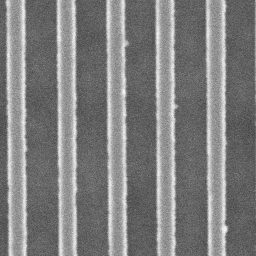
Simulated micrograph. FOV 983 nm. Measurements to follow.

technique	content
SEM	lines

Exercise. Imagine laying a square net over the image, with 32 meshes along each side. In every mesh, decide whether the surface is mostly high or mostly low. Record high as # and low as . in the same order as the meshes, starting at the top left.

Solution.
.##....##....###....##....##....
.##....##....###....##....##....
.##....##....###....##....##....
.##....##....###....##....##....
.##....##....###....##....##....
.##....##....###....##....##....
.##....##....###....##....##....
.##....##....###....##....##....
.##....##.....##....##....##....
.##....##.....##....##....##....
.##....##.....##....##....##....
.##....##.....##....##....##....
.##....##.....##....##....##....
.##....##.....##....##....##....
.##....##.....##....##....##....
.##....##.....##....##....##....
.##....##.....##....##....##....
.##....##.....##....##....##....
.##....##.....##....##....##....
.##....##.....##....##....##....
.##....##.....##....##....##....
.##....##.....##....##....##....
.##....##.....##....##....##....
.##....##.....##....##....##....
.##....##.....##....##....##....
.##....##.....##....##....##....
.##....##.....##....##....##....
.##....##.....##....##....##....
.##....##.....##....##....##....
.##....##.....##....##....##....
.##....##.....##....##....##....
.##....##.....##....##....##....